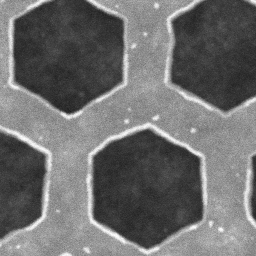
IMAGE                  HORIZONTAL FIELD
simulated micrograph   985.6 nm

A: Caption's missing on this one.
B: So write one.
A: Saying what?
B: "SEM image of holes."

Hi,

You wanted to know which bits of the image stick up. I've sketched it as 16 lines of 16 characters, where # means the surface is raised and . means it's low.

##....######....
#.......###.....
#.......###.....
#.......###.....
#.......###.....
#......####.....
###...#######..#
################
.#######..######
...###......####
...###.......###
...###.......###
...###.......###
...###.......###
.######....#####
#########.######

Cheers